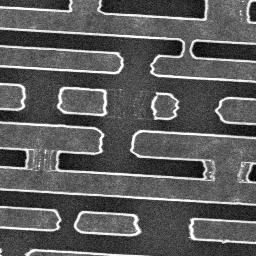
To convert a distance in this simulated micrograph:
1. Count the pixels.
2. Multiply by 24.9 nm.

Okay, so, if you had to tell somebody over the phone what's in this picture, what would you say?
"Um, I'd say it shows parallel lines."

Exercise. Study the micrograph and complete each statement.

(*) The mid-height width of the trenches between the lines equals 0.444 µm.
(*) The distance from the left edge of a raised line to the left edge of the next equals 996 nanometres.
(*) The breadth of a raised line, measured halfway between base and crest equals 515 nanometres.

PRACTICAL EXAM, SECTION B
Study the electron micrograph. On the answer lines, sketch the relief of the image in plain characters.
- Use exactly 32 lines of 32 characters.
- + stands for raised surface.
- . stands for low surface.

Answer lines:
.........++++.............+++++.
+++++++++++++.............+++++.
+++++++++++++++++++++++++++++++.
++++++++++++++++++++++++++++++++
.................+++++++++++++++
.......................+........
+++++++++++............+........
+++++++++++++++....+++++++++....
.....++++++++++....+++++++++++++
.....................+++++++++++
................................
+++.....+++++...................
+++.....+++++......+++......++++
+++....++++++......+++.....+++++
...................+++......++++
+++.............................
++++++++++++.....++.............
+++++++++++++....+++++++++++++++
+++++++++++++...++++++++++++++++
...++++..........+++++++++++++++
...++++..................+++++++
+++++++++.................+++++.
+++++++++++++++++++++++++++++++.
++++++++++++++++++++++++++++++++
..............++++++++++++++++++
..............................++
+++++++.........................
+++++++...+++++++.......+++.....
..+++++...+++++++.......++++++++
........................++++++++
................................
....++++........................